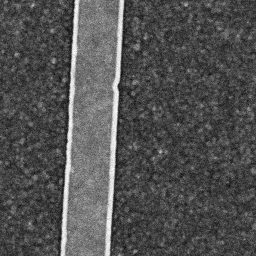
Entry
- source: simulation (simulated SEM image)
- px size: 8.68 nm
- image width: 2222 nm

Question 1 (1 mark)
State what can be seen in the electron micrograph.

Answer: one or a few lines or trenches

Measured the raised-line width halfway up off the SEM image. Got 387 nm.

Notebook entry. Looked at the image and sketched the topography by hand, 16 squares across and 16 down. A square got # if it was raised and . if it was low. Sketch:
.....###........
.....###........
.....###........
.....##.........
.....##.........
....###.........
....###.........
....###.........
....###.........
....###.........
....###.........
....###.........
....###.........
....###.........
....###.........
....###.........